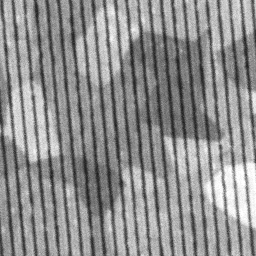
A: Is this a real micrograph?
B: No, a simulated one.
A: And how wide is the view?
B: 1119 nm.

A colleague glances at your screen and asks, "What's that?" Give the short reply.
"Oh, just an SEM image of parallel lines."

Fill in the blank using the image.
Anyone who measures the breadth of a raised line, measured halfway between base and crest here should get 0.0343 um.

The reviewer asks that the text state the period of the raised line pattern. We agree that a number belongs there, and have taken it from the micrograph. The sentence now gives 49.7 nanometres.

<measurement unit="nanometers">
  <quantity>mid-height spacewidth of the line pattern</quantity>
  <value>13.1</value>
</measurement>